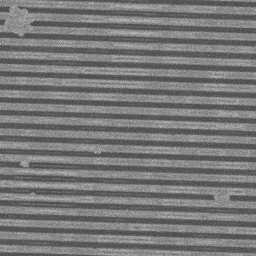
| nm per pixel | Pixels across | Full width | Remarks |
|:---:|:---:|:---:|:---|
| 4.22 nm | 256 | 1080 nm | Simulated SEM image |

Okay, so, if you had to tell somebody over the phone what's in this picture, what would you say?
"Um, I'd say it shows parallel lines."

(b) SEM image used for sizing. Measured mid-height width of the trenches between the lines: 0.0232 microns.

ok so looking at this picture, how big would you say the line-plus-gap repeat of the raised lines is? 54.5 nm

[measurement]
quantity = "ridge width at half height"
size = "30.6 nm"